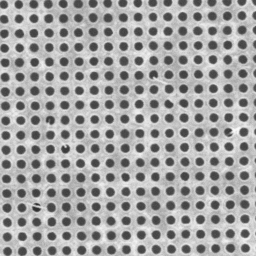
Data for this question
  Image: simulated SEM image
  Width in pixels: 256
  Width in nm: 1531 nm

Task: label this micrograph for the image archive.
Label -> a regular array of holes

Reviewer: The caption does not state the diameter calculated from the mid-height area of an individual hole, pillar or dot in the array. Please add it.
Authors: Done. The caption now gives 9.1 px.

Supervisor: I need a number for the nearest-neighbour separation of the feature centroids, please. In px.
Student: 14.4